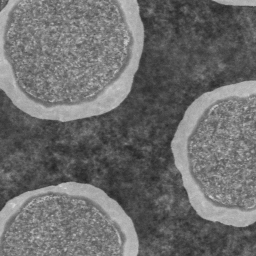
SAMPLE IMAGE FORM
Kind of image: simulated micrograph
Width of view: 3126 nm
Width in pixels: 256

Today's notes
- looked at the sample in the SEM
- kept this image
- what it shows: raised bodies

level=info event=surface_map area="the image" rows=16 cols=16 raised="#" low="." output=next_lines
.#######........
########........
#########.......
#########.......
########........
.######.......##
..####.......###
............####
............####
...........#####
...........#####
............####
.#####......####
########......##
########........
########........